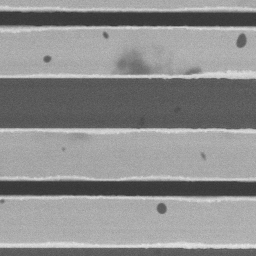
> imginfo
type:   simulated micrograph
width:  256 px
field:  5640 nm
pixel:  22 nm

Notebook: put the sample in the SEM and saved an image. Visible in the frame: lines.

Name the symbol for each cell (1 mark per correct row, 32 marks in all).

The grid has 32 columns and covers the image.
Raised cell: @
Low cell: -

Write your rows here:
@@@@@@@@@@@@@@@@@@@@@@@@@@@@@@@@
--------------------------------
--------------------------------
@@@@@@@@@@@@@@@@@@@@@@@@@@@@@@@@
@@@@@@@@@@@@@@@@@@@@@@@@@@@@@@@@
@@@@@@@@@@@@@@@@@@@@@@@@@@@@@@@@
@@@@@@@@@@@@@@@@@@@@@@@@@@@@@@@@
@@@@@@@@@@@@@@@@@@@@@@@@@@@@@@@@
@@@@@@@@@@@@@@@@@@@@@@@@@@@@@@@@
@@@@@@@@@@@@@@@@@@@@@@@@@@@@@@@@
--------------------------------
--------------------------------
--------------------------------
--------------------------------
--------------------------------
--------------------------------
@@@@@@@@@@@@@@@@@@@@@@@@@@@@@@@@
@@@@@@@@@@@@@@@@@@@@@@@@@@@@@@@@
@@@@@@@@@@@@@@@@@@@@@@@@@@@@@@@@
@@@@@@@@@@@@@@@@@@@@@@@@@@@@@@@@
@@@@@@@@@@@@@@@@@@@@@@@@@@@@@@@@
@@@@@@@@@@@@@@@@@@@@@@@@@@@@@@@@
@@@@@@@--@@@@@@@@@@@@@@@@@@@@@@@
--------------------------------
-------@@-----------------------
@@@@@@@@@@@@@@@@@@@@@@@@@@@@@@@@
@@@@@@@@@@@@@@@@@@@@@@@@@@@@@@@@
@@@@@@@@@@@@@@@@@@@@@@@@@@@@@@@@
@@@@@@@@@@@@@@@@@@@@@@@@@@@@@@@@
@@@@@@@@@@@@@@@@@@@@@@@@@@@@@@@@
@@@@@@@@@@@@@@@@@@@@@@@@@@@@@@@@
--------------------------------